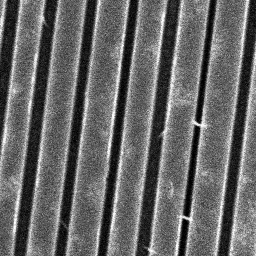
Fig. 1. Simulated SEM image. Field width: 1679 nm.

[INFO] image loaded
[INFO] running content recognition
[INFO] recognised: parallel lines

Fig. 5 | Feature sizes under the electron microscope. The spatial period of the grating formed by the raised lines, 261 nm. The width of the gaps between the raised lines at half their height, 10.8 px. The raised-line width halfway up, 0.188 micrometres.